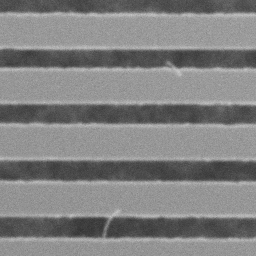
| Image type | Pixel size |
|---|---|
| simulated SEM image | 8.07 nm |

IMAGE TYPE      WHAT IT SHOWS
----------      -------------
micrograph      lines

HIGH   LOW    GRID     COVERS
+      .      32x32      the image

................................
................................
++++++++++++++++++++++++++++++++
++++++++++++++++++++++++++++++++
++++++++++++++++++++++++++++++++
++++++++++++++++++++++++++++++++
................................
................................
....................++..........
++++++++++++++++++++++++++++++++
++++++++++++++++++++++++++++++++
++++++++++++++++++++++++++++++++
++++++++++++++++++++++++++++++++
................................
................................
++++++.+.++++..........+........
++++++++++++++++++++++++++++++++
++++++++++++++++++++++++++++++++
++++++++++++++++++++++++++++++++
++++++++++++++++++++++++++++++++
................................
................................
................................
++++++++++++++++++++++++++++++++
++++++++++++++++++++++++++++++++
++++++++++++++++++++++++++++++++
++++++++++++++++++++++++++++++++
................................
................................
................................
++++++++++++++++++++++++++++++++
++++++++++++++++++++++++++++++++